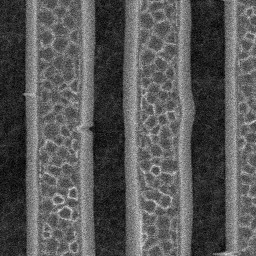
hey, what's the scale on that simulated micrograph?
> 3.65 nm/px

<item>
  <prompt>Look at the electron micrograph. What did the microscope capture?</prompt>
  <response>one or a few lines or trenches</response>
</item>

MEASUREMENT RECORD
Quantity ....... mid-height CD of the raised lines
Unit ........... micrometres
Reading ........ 0.196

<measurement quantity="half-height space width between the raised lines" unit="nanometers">166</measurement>